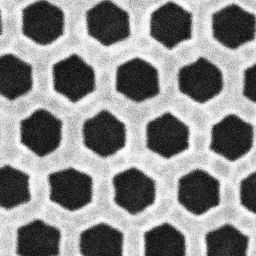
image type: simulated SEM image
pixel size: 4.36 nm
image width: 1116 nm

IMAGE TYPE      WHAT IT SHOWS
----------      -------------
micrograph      a regular array of holes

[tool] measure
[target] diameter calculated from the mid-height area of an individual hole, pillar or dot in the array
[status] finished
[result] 198 nanometers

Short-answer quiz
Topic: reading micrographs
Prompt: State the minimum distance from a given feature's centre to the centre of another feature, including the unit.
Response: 276 nanometres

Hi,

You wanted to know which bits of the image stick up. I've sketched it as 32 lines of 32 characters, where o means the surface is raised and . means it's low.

oooo...ooooo...ooooo..ooooooo.oo
ooo.....ooo.....ooo.....ooo....o
ooo.....ooo.....ooo.....oo......
ooo.....ooo.....ooo.....oo......
ooo.....ooo.....ooo.....ooo.....
ooooo.ooooooo.oooooo...ooooo...o
oooooooooooooooooooooooooooooooo
...oooo...oooooo..oooooo..oooooo
....oo......ooo.....ooo....oooo.
....ooo.....oo......oo......oo..
....ooo.....oo......oo......oo..
....ooo.....ooo.....ooo.....oo..
o.oooooo..oooooo..oooooo..ooooo.
oooooooooooooooooooooooooooooooo
oooo...ooooo..oooooo..oooooo..oo
oo......oo......oo.....oooo....o
oo......oo......oo......oo......
oo......oo......oo......oo......
ooo....oooo.....oo......oo......
ooooo.oooooo..oooooo..oooooo..oo
oooooooooooooooooooooooooooooooo
...oooo....oooo...oooooo..oooooo
....oo......oo.....ooo.....ooo..
....oo......oo......oo......oo..
....oo......oo.....ooo......oo..
...oooo....ooo.....ooo.....ooo..
oooooooooooooooo..oooooo..ooooo.
oooo.ooooooooooooooooooooooooooo
oo.....oooo....oooo...ooooo...oo
oo......oo.....ooo.....ooo.....o
oo......oo......oo.....ooo.....o
oo.....ooo.....ooo.....ooo.....o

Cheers